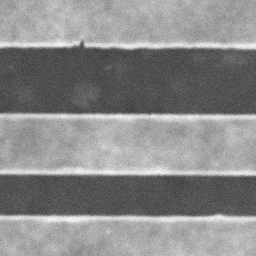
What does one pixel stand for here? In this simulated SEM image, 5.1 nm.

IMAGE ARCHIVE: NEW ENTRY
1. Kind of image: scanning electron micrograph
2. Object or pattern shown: one or a few lines or trenches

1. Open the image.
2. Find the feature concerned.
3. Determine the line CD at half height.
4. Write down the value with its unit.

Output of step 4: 294 nm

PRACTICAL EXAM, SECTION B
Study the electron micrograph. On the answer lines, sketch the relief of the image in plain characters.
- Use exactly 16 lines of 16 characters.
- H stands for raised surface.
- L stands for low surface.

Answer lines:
HHHHHHHHHHHHHHHH
HHHHHHHHHHHHHHHH
HHHHHHHHHHHHHHHH
LLLLLLLLLLLLLLLL
LLLLLLLLLLLLLLLL
LLLLLLLLLLLLLLLL
LLLLLLLLLLLLLLLL
HHHHHHHHHHHHHHHH
HHHHHHHHHHHHHHHH
HHHHHHHHHHHHHHHH
HHHHHHHHHHHHHHHH
LLLLLLLLLLLLLLLL
LLLLLLLLLLLLLLLL
LLLLLLLLLLLLLLLL
HHHLLHHHHHHHHHHH
HHHLLLHHHHHHHHHH